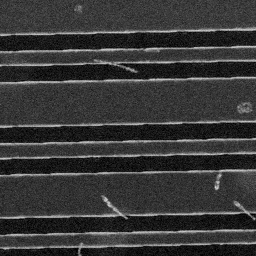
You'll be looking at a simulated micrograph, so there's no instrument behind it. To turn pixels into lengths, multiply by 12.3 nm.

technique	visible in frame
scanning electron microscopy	lines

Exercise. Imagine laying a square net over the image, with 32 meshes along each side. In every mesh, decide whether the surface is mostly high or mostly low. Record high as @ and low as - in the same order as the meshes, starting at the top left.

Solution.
@@@@@@@@@@@@@@@@@@@@@@@@@@@@@@@@
@@@@@@@@@@@@@@@@@@@@@@@@@@@@@@@@
@@@@@@@@@@@@@@@@@@@@@@@@@@@@@@@@
@@@@@@@@@@@@@@@@@@@@@@@@@@@@@@@@
--------------------------------
--------------------------------
--@@@@@@@@@@@@@@@@@@@@@@@@@@@@@@
@@@@@@@@@@@@@@@@@@@@@@@@@@@@@@@@
--------------------------------
--------------------------------
@@@@@@@@@@@@@@@@@@@@@@@@@@@@@@@@
@@@@@@@@@@@@@@@@@@@@@@@@@@@@@@@@
@@@@@@@@@@@@@@@@@@@@@@@@@@@@@@@@
@@@@@@@@@@@@@@@@@@@@@@@@@@@@@@@@
@@@@@@@@@@@@@@@@@@@@@@@@@@@@@@@@
@@@@@@@@@@@@@@@@@@--------------
--------------------------------
--------------------------@@@@@@
@@@@@@@@@@@@@@@@@@@@@@@@@@@@@@@@
@@@@@@@@@@@@@@@@@---------------
--------------------------------
-----------------------@@@@@@@@@
@@@@@@@@@@@@@@@@@@@@@@@@@@@@@@@@
@@@@@@@@@@@@@@@@@@@@@@@@@@@@@@@@
@@@@@@@@@@@@@@@@@@@@@@@@@@@@@@@@
@@@@@@@@@@@@@@@@@@@@@@@@@@@@@@@@
@@@@@@@@@@@@@@@@@@@@@@@@@@@@@@@@
--------------------------------
--------------------------------
@@@@@@@@@@@@@@@@@@@@@@@@@@@@@@@@
@@@@@@@@@@@@@@@@@@@@@@@@@@------
--------------------------------